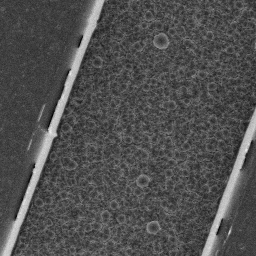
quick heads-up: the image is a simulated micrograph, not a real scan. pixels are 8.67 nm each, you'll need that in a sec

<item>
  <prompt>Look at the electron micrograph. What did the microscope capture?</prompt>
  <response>one or a few lines or trenches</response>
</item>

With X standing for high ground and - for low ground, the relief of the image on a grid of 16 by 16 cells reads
XXXXXX----------
XXXXXX----------
XXXXX-----------
XXXXX-----------
XXXXX-----------
XXXX------------
XXXX------------
XXXX------------
XXX-------------
XXX------------X
XX-------------X
XX------------XX
XX------------XX
X-------------XX
X------------XXX
X------------XXX